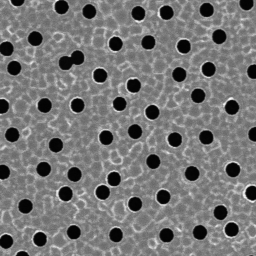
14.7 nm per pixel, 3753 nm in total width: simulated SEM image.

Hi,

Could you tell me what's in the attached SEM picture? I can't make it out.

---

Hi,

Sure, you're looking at a regular array of holes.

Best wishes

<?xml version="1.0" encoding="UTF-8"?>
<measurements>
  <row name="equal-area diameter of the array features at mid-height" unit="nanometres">218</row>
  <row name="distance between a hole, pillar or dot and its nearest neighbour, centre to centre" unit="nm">430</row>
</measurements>